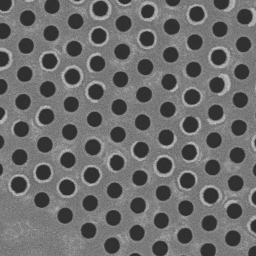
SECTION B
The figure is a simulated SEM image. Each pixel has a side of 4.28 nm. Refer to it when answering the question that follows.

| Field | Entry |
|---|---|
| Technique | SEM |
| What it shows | a regular array of holes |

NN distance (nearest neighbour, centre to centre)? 117 nm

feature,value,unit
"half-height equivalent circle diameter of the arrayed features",65.5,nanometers